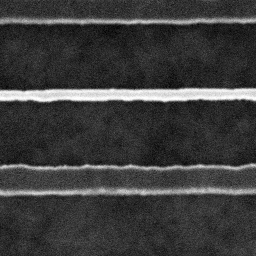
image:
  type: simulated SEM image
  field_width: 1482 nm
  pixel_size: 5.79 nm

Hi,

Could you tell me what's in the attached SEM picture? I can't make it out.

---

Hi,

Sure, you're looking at lines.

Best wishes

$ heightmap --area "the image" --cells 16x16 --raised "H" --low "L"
HHHHHHHHHHHHHHHH
LLLLLLLLLLLLLLLL
LLLLLLLLLLLLLLLL
LLLLLLLLLLLLLLLL
LLLLLLLLLLLLLLLL
LLLLLLLLLLLLLLLL
LLLLLLLLLLLLLLLL
LLLLLLLLLLLLLLLL
LLLLLLLLLLLLLLLL
LLLLLLLLLLLLLLLL
HHHHHHHHHHHHHHHH
HHHHHHHHHHHHHHHH
LLLLLLLLLLLLLLLL
LLLLLLLLLLLLLLLL
LLLLLLLLLLLLLLLL
LLLLLLLLLLLLLLLL